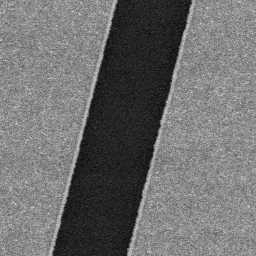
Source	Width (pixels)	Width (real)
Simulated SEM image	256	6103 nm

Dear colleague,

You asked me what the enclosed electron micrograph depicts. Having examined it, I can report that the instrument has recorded one or a few lines or trenches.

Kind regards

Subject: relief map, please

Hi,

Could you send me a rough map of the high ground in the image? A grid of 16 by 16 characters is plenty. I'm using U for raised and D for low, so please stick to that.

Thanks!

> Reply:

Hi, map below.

UUUUUUUDDDDDUUUU
UUUUUUUDDDDDUUUU
UUUUUUUDDDDUUUUU
UUUUUUDDDDDUUUUU
UUUUUUDDDDDUUUUU
UUUUUUDDDDDUUUUU
UUUUUUDDDDUUUUUU
UUUUUDDDDDUUUUUU
UUUUUDDDDDUUUUUU
UUUUUDDDDDUUUUUU
UUUUUDDDDUUUUUUU
UUUUDDDDDUUUUUUU
UUUUDDDDDUUUUUUU
UUUUDDDDDUUUUUUU
UUUDDDDDUUUUUUUU
UUUDDDDDUUUUUUUU